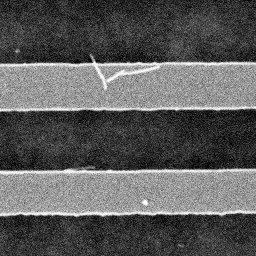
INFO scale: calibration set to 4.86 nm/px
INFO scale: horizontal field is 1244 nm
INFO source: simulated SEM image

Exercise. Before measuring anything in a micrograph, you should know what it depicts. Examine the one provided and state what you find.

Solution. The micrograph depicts lines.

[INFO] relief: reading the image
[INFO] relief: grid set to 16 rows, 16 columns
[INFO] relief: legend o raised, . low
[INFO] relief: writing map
................
................
................
................
oooooooooooooooo
oooooooooooooooo
oooooooooooooooo
................
................
................
................
oooooooooooooooo
oooooooooooooooo
................
................
................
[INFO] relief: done